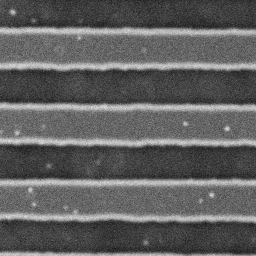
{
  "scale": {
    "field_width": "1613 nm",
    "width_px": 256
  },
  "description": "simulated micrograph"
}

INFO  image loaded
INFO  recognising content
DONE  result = lines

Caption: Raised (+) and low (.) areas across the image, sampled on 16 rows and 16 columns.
................
................
++++++++++++++++
++++++++++++++++
................
................
................
++++++++++++++++
++++++++++++++++
................
................
++++++++++++++++
++++++++++++++++
++++++++++++++++
................
................